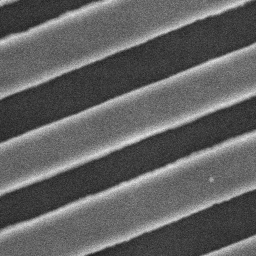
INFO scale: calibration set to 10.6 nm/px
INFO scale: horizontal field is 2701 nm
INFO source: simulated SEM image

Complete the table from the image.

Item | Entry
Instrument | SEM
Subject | lines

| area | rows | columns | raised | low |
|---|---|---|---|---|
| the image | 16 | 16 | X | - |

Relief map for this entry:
-----XXXXXXXXX--
---XXXXXXXXX----
XXXXXXXXX-------
XXXXXXX-------XX
XXXX--------XXXX
XX-------XXXXXXX
-------XXXXXXX--
----XXXXXXXX----
-XXXXXXXX------X
XXXXXXX------XXX
XXXX------XXXXXX
XX------XXXXXXXX
-----XXXXXXXXX--
---XXXXXXXXX----
XXXXXXXXX-------
XXXXXX--------XX